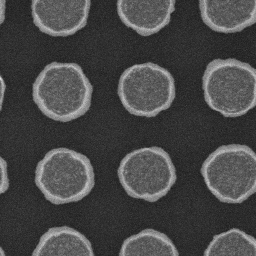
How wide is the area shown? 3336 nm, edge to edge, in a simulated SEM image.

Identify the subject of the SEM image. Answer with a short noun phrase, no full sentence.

raised bodies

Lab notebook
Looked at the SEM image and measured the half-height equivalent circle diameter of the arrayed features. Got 0.672 µm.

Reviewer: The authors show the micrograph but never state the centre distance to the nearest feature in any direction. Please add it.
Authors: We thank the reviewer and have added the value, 1090 nm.